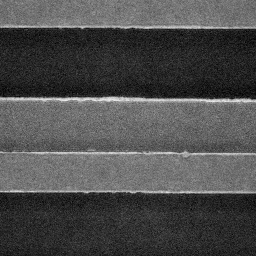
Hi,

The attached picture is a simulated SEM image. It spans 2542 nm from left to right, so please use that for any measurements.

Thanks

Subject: lines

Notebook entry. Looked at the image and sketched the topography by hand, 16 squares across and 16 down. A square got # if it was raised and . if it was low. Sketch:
################
################
................
................
................
................
################
################
################
################
################
################
................
................
................
................